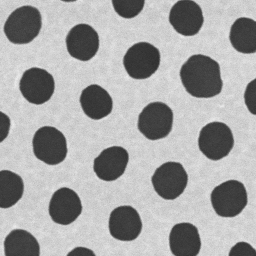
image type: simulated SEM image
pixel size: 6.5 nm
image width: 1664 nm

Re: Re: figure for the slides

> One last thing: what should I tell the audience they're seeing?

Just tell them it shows a regular array of holes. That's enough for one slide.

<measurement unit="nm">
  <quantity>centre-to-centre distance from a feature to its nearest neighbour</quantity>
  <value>398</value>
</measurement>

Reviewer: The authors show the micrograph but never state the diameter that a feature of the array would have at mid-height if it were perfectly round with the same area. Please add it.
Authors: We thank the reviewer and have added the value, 238 nanometres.